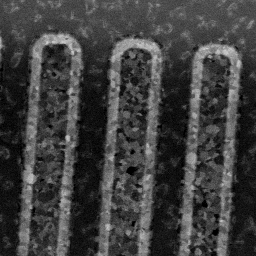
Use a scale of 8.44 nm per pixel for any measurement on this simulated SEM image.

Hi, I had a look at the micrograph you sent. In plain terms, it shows one or a few lines or trenches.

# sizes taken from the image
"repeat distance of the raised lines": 676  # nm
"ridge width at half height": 339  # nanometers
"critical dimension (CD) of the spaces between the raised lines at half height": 40.2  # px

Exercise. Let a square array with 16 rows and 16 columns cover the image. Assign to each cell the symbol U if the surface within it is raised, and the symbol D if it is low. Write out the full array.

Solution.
DDDDDDDDDDDDDDDD
DDDDDDDDDDDDDDDD
DDDUDDDDDDDDDDDD
DDUUUDDUUUDDDUDD
DDUUUDDUUUDDUUUD
DDUUUDDUUUDDUUUD
DDUUUDDUUUDDUUUD
DDUUUDDUUUDDUUDD
DDUUDDDUUUDDUUDD
DDUUDDDUUDDDUUDD
DDUUDDDUUDDDUUDD
DDUUDDDUUDDDUUDD
DDUUDDDUUDDDUUDD
DDUUDDDUUDDDUUDD
DUUUDDDUUDDDUUDD
DUUUDDUUUDDDUUDD